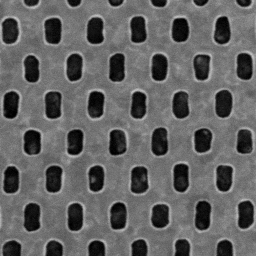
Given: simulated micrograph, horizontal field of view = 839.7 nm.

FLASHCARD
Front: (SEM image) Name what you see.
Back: a regular array of holes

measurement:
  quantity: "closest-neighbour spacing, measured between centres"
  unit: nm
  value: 138